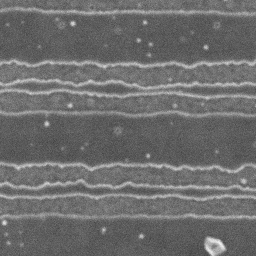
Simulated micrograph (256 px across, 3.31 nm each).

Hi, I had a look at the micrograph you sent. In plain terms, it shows lines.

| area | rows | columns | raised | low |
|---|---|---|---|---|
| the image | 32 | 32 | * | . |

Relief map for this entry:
................................
***********.****************....
********************************
********************************
********************************
********************************
********************************
********************************
................................
................................
****************......*.********
...****..***********************
................................
................................
********************************
********************************
********************************
********************************
********************************
********************************
********************************
.............................*..
................................
******************************..
*********..***.*****************
................................
................................
********************************
********************************
********************************
********************************
********************************